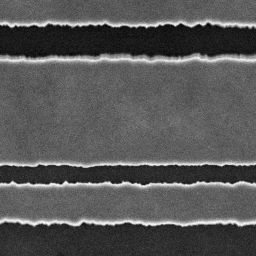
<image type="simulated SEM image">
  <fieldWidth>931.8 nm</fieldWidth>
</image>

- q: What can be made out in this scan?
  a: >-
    lines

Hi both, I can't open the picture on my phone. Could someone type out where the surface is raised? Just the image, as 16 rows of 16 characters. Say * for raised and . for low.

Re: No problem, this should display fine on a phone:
****************
***.******.*..**
................
................
****************
****************
****************
****************
****************
****************
****************
****************
****************
****************
................
................